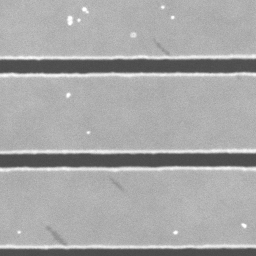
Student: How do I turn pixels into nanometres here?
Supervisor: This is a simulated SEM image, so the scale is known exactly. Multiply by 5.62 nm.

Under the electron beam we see lines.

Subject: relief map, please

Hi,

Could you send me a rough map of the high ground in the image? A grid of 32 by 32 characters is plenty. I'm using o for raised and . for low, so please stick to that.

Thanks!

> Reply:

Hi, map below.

oooooooooooooooooooooooooooooooo
oooooooooooooooooooooooooooooooo
oooooooooooooooooooooooooooooooo
oooooooooooooooooooooooooooooooo
oooooooooooooooooooooooooooooooo
oooooooooooooooooooooooooooooooo
oooooooooooooooooooooooooooooooo
................................
................................
oooooooooooooooooooooooooooooooo
oooooooooooooooooooooooooooooooo
oooooooooooooooooooooooooooooooo
oooooooooooooooooooooooooooooooo
oooooooooooooooooooooooooooooooo
oooooooooooooooooooooooooooooooo
oooooooooooooooooooooooooooooooo
oooooooooooooooooooooooooooooooo
oooooooooooooooooooooooooooooooo
oooooooooooooooooooooooooooooooo
................................
................................
oooooooooooooooooooooooooooooooo
oooooooooooooooooooooooooooooooo
oooooooooooooooooooooooooooooooo
oooooooooooooooooooooooooooooooo
oooooooooooooooooooooooooooooooo
oooooooooooooooooooooooooooooooo
oooooooooooooooooooooooooooooooo
oooooooooooooooooooooooooooooooo
oooooooooooooooooooooooooooooooo
oooooooooooooooooooooooooooooooo
................................